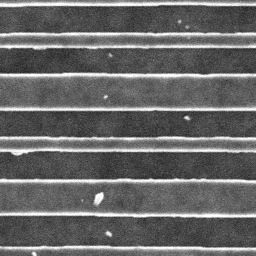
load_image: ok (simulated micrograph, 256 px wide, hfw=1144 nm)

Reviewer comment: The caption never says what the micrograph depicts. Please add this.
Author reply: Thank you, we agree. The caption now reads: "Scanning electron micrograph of lines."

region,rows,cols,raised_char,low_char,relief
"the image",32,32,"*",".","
********************************
................................
................................
................................
********************************
********************************
................................
................................
................................
********************************
********************************
********************************
********************************
********************************
................................
................................
................................
********************************
********************************
................................
................................
................................
................................
********************************
********************************
********************************
********************************
................................
................................
................................
................................
********************************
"